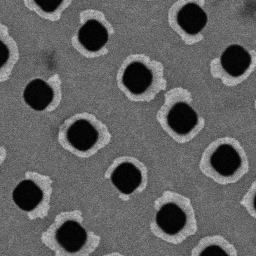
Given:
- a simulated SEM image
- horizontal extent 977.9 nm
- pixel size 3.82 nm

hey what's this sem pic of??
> a regular array of holes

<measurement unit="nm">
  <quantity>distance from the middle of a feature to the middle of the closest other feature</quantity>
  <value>231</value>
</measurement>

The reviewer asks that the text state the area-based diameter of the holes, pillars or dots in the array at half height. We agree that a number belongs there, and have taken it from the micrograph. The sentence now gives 111 nanometres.